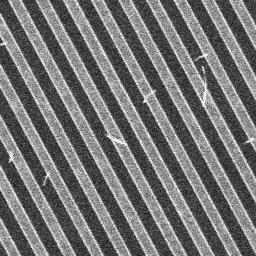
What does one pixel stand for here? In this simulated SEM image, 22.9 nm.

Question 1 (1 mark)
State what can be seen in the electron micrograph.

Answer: parallel lines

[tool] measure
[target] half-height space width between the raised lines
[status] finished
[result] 318 nm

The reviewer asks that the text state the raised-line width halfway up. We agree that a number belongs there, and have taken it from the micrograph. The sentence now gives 240 nanometers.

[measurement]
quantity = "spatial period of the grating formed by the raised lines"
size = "557 nm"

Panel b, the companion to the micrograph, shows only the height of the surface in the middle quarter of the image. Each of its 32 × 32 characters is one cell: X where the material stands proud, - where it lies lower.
--XXX----XXX----XXX----XXX----XX
---XX----XXX----XXX----XXX----XX
---XXX----XXX----XXX----XXX----X
----XXX----XX----XXX----XXX----X
----XXX----XXX----XXX----XXX----
X----XXX---XXXX----XX----XXX----
X----XXX----XXX----XXX----XXX---
XX----XXX----XXX----XX----XXX---
XX----XXX----XXX----XXX----XXX--
XXX----XXX----XXX---XXX-----XX--
-XX----XXX----XXX----XXX----XXX-
-XXX----XXX----XXX----XXX----XXX
--XXX----XX----XXX----XXX----XXX
--XXX----XXX----XXX----XXX----XX
---XXX----XXX---XXX----XXX----XX
---XXX----XXX----XXX----XXX----X
----XXX----XXX---XXX-----XX----X
----XXX----XXX----XXX----XXX----
X----XXX---XXXX----XXX----XX----
X----XXX----XXX----XXX----XXX---
XX----XXX----XXX----XXX----XX---
XX-----XX----XXX----XXX----XXX--
XXX----XXX----XXX----XXX----XX--
-XX-----XX----XXX----XXX----XXX-
-XXX----XXX----XXX----XXX----XXX
--XX-----XXX----XX----XXX----XXX
--XXX----XXX----XXX----XXX----XX
---XXX----XXX----XXX---XXX----XX
---XXX----XXX----XXX----XXX----X
----XXX----XXX----XXX---XXXX----
----XXX----XXX----XXX----XXX----
X----XXX----XXX----XXX----XXX---